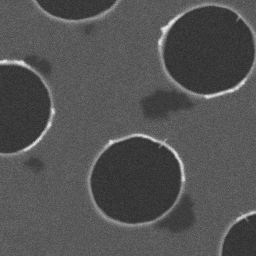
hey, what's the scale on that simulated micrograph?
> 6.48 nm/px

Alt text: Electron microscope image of holes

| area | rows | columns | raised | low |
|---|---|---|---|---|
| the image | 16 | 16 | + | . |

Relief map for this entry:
+++....+++++..++
+++++++++++....+
++++++++++......
++++++++++......
..+++++++++.....
...+++++++++...+
...+++++++++++++
...+++++++++++++
..++++++++++++++
.++++++....+++++
++++++.....+++++
++++++.....+++++
++++++.....+++++
+++++++...++++++
++++++++++++++..
++++++++++++++..